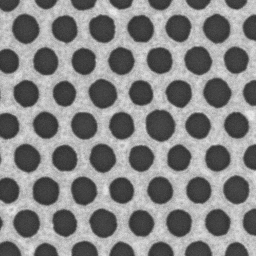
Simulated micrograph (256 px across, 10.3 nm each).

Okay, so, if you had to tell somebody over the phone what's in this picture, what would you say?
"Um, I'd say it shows a regular array of holes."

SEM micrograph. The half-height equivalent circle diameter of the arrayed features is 287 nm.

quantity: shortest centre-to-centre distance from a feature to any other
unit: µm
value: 0.385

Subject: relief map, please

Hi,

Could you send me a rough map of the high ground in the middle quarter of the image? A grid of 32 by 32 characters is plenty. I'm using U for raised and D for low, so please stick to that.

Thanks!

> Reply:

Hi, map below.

UUDDDDDDUUUDDDDDDUUUUDDDDDDUUUDD
UUDDDDDDUUUUDDDDDUUUUUDDDDDUUUUD
UUUUDDUUUUUUUDDDUUUUUUUDDUUUUUUU
UUUUUUUUUUUUUUUUUUUUUUUUUUUUUUUU
DDUUUUUDDDDDUUUUUDDDDUUUUUUDDDDU
DDDUUUDDDDDDDUUUDDDDDDUUUUDDDDDD
DDDUUUDDDDDDDUUUDDDDDDUUUDDDDDDD
DDDUUUDDDDDDDDUUDDDDDDDUUDDDDDDD
DDDUUUDDDDDDDUUUDDDDDDUUUDDDDDDD
DDUUUUUDDDDDDUUUUDDDDDUUUUDDDDDU
DDUUUUUUDDDDUUUUUUDDUUUUUUUDDDDU
UUUUUUUUUUUUUUUUUUUUUUDDDDUUUUUU
UUUDDDDUUUUUUDDDUUUUUDDDDDDUUUUU
UUDDDDDDUUUUDDDDDUUUDDDDDDDUUUUD
UUDDDDDDUUUDDDDDDDUUDDDDDDDDUUDD
UDDDDDDDUUUDDDDDDDUUDDDDDDDDUUDD
UUDDDDDDUUUDDDDDDDUUDDDDDDDDUUDD
UUDDDDDDUUUUDDDDDUUUUDDDDDDDUUUD
UUUDDDDUUUUUUDDDUUUUUUDDDDDUUUUU
UUUUUUUUUUUUUUUUUUUUUUUDDUUUUUUU
DDUUUUUDDDDDUUUUUDDDDUUUUUUDDDUU
DDDUUUUDDDDDUUUUDDDDDDUUUUDDDDDU
DDDUUUDDDDDDDUUUDDDDDDUUUUDDDDDD
DDDDUUDDDDDDDUUUDDDDDDDUUDDDDDDD
DDDDUUDDDDDDDUUUDDDDDDUUUUDDDDDD
DDDUUUUDDDDDDUUUDDDDDDUUUUDDDDDU
DDUUUUUUDDDDUUUUUUDDDUUUUUUDDDUU
UUUUUUUUUUUUUUUUUUUUUUUUUUUUUUUU
UUUDDDDUUUUUUDDDUUUUUUDDDDUUUUUU
UUDDDDDDUUUUDDDDDUUUUDDDDDDUUUUD
UUDDDDDDUUUDDDDDDUUUUDDDDDDUUUDD
UDDDDDDDUUUDDDDDDDUUUDDDDDDUUUDD